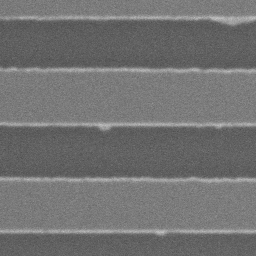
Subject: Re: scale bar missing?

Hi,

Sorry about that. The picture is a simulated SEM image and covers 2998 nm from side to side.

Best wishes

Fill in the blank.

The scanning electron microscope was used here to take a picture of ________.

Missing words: lines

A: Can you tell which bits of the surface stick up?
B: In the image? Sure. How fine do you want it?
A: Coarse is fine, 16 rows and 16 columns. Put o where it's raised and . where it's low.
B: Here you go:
oooooooooooooooo
................
................
................
oooooooooooooooo
oooooooooooooooo
oooooooooooooooo
oooooooooooooooo
................
................
................
oooooooooooooooo
oooooooooooooooo
oooooooooooooooo
................
................